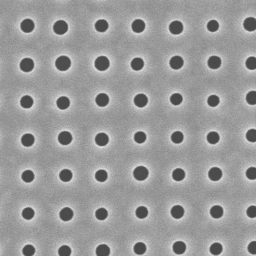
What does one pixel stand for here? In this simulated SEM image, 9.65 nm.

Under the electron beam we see a regular array of holes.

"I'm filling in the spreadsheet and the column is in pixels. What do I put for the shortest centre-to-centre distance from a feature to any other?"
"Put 36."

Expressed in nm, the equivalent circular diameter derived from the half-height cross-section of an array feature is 135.